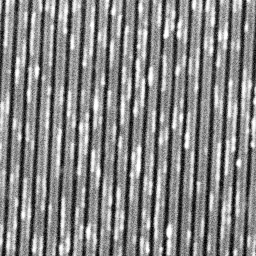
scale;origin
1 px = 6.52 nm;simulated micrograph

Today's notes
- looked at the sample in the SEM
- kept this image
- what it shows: parallel lines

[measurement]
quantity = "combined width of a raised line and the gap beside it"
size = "87.1 nm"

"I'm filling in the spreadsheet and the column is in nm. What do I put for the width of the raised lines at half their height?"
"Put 47.2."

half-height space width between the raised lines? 35.8 nm